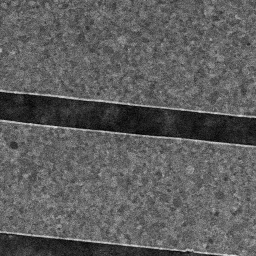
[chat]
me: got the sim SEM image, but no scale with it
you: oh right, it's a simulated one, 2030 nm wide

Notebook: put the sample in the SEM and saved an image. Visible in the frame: one or a few lines or trenches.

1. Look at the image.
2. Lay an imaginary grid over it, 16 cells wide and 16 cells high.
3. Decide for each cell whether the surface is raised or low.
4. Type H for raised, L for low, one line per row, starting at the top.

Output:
HHHHHHHHHHHHHHHH
HHHHHHHHHHHHHHHH
HHHHHHHHHHHHHHHH
HHHHHHHHHHHHHHHH
HHHHHHHHHHHHHHHH
HHHHHHHHHHHHHHHH
LLLLLLLLHHHHHHHH
LLLLLLLLLLLLLLLL
HHHHHHHHHLLLLLLL
HHHHHHHHHHHHHHHH
HHHHHHHHHHHHHHHH
HHHHHHHHHHHHHHHH
HHHHHHHHHHHHHHHH
HHHHHHHHHHHHHHHH
HHHHHHHHHHHHHHHH
LLLLLLLLLLHHHHHH